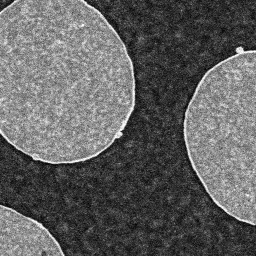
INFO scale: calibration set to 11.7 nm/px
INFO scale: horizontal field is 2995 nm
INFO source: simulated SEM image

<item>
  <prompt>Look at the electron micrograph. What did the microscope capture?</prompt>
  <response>raised bodies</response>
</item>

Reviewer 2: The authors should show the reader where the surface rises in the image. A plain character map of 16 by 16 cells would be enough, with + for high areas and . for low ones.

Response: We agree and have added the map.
++++++..........
+++++++.........
++++++++........
++++++++.......+
++++++++.....+++
++++++++....++++
++++++++....++++
++++++++....++++
+++++++.....++++
..++++......++++
............++++
.............+++
.............+++
+..............+
+++.............
++++............